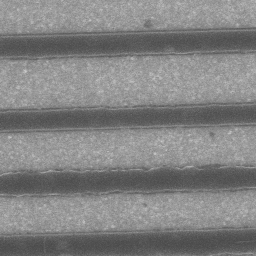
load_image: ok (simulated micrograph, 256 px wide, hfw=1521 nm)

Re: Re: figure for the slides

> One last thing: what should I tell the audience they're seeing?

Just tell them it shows one or a few lines or trenches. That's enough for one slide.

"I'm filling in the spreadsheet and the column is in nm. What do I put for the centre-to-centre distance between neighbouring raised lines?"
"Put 406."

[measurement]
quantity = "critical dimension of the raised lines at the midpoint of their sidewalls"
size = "130 nm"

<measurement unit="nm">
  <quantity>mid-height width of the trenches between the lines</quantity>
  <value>249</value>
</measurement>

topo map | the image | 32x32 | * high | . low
................................
................................
................................
................................
....****************************
********************************
**************************......
................................
................................
................................
................................
................................
................................
............**..****************
********************************
******************************.*
................................
................................
................................
................................
................................
...*****************************
********************************
********************************
................................
................................
................................
................................
................................
********************************
********************************
********************************